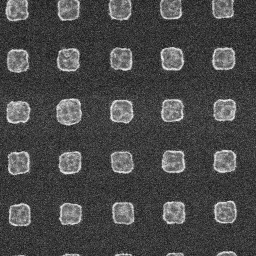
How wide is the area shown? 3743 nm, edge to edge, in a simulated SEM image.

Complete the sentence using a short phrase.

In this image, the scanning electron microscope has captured a regular array of raised bodies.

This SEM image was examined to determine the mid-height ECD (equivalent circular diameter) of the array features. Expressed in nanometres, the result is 332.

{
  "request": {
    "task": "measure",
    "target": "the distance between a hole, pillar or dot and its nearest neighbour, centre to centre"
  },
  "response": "0.745 micrometres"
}